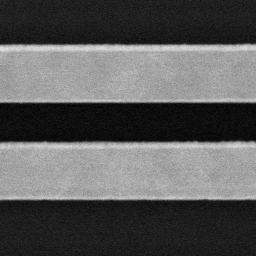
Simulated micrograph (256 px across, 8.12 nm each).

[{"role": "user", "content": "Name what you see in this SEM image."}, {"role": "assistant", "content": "lines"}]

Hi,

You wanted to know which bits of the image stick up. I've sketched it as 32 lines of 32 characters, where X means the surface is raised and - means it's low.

--------------------------------
--------------------------------
--------------------------------
--------------------------------
--------------------------------
--------------------------------
XXXXXXXXXXXXXXXXXXXXXXXXXXXXXXXX
XXXXXXXXXXXXXXXXXXXXXXXXXXXXXXXX
XXXXXXXXXXXXXXXXXXXXXXXXXXXXXXXX
XXXXXXXXXXXXXXXXXXXXXXXXXXXXXXXX
XXXXXXXXXXXXXXXXXXXXXXXXXXXXXXXX
XXXXXXXXXXXXXXXXXXXXXXXXXXXXXXXX
XXXXXXXXXXXXXXXXXXXXXXXXXXXXXXXX
--------------------------------
--------------------------------
--------------------------------
--------------------------------
--------------------------------
XXXXXXXXXXXXXXXXXXXXXXXXXXXXXXXX
XXXXXXXXXXXXXXXXXXXXXXXXXXXXXXXX
XXXXXXXXXXXXXXXXXXXXXXXXXXXXXXXX
XXXXXXXXXXXXXXXXXXXXXXXXXXXXXXXX
XXXXXXXXXXXXXXXXXXXXXXXXXXXXXXXX
XXXXXXXXXXXXXXXXXXXXXXXXXXXXXXXX
XXXXXXXXXXXXXXXXXXXXXXXXXXXXXXXX
--------------------------------
--------------------------------
--------------------------------
--------------------------------
--------------------------------
--------------------------------
--------------------------------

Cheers